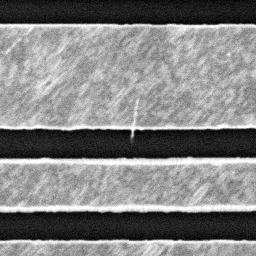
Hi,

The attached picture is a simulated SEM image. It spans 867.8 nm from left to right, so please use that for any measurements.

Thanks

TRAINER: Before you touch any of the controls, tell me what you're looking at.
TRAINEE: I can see lines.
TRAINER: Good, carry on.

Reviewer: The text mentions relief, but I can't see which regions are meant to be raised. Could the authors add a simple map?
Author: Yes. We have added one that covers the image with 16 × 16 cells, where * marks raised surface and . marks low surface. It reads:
................
................
****************
****************
****************
****************
****************
****************
................
................
****************
****************
****************
................
................
****************